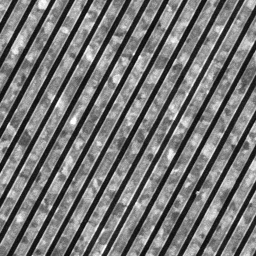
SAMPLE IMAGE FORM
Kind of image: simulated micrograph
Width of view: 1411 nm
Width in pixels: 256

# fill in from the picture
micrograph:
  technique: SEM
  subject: parallel lines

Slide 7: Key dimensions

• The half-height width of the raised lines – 62.4 nm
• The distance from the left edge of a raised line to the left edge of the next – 91.5 nm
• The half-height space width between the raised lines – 31.6 nm